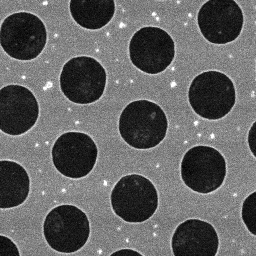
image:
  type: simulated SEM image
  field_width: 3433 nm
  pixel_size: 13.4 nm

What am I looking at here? a regular array of holes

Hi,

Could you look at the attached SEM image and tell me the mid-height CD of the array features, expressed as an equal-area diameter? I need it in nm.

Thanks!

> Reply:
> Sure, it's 635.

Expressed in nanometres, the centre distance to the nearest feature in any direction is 1000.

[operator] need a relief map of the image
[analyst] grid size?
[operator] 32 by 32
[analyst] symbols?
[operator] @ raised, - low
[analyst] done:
@@@@@@@@@-----@@@@@@@@@@@@----@@
@@@@@@@@@-----@@@@@@@@@@@-----@@
@----@@@@-----@@@@@@@@@@@-----@@
------@@@@@--@@@@@--@@@@@-----@@
------@@@@@@@@@@@----@@@@-----@@
------@@@@@@@@@@------@@@@@@@@@@
@----@@@@@@@@@@@------@@@@@@@@@@
@@--@@@@@---@@@@------@@@@@@@@@@
@@@@@@@@-----@@@@----@@@@@@@@@@@
@@@@@@@@-----@@@@@@@@@@@@---@@@@
@@@@@@@@-----@@@@@@@@@@@-----@@@
----@@@@-----@@@@@@@@@@@-----@@@
-----@@@@---@@@@@@@@@@@@-----@@@
-----@@@@@@@@@@@----@@@@-----@@@
-----@@@@@@@@@@------@@@@---@@@@
----@@@@@@@@@@@------@@@@@@@@@@@
---@@@@@@@@@@@@------@@@@@@@@@@-
@@@@@@@-----@@@@----@@@@@@@@@@@-
@@@@@@@-----@@@@@--@@@@@---@@@@-
@@@@@@@-----@@@@@@@@@@@-----@@@@
--@@@@@-----@@@@@@@@@@@-----@@@@
---@@@@----@@@@@@@@@@@@-----@@@@
----@@@@@@@@@@@----@@@@-----@@@@
----@@@@@@@@@@-----@@@@@---@@@@@
---@@@@@@@@@@@------@@@@@@@@@@@-
---@@@@@@@@@@@------@@@@@@@@@@--
@@@@@@----@@@@-----@@@@@@@@@@@--
@@@@@@-----@@@@@--@@@@@@-@@@@@--
@@@@@------@@@@@@@@@@@-----@@@@-
@@@@@@-----@@@@@@@@@@@-----@@@@@
--@@@@-----@@@@@@@@@@------@@@@@
--@@@@@@-@@@@@---@@@@@-----@@@@@